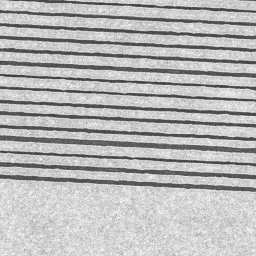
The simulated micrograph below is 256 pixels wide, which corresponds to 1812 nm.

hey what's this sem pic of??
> parallel lines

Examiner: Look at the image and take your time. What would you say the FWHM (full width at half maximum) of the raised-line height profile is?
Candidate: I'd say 63.6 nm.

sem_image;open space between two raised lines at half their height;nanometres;24.8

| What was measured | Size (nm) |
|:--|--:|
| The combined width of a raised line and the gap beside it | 90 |